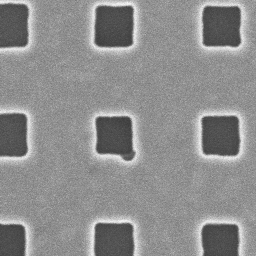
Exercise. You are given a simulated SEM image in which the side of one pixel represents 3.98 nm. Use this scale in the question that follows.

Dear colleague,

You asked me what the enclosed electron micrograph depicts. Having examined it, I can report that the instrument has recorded holes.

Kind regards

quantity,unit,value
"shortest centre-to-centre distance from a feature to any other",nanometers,425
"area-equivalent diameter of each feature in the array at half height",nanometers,176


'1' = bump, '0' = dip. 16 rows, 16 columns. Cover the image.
0011110011111001
0011110011111001
0011110011111001
1111111111111111
1111111111111111
1111111111111111
1111111111111111
0011110011111001
0011110011111001
0011110011111001
1111111111111111
1111111111111111
1111111111111111
1111111111111111
0011110011111001
0011110011111001